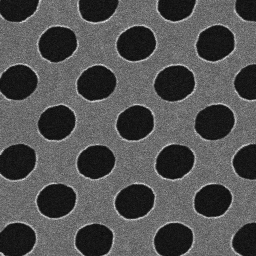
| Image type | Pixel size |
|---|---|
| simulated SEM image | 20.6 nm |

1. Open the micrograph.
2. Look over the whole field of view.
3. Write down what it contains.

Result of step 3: a regular array of holes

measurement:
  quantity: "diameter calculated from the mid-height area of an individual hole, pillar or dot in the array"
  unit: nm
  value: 763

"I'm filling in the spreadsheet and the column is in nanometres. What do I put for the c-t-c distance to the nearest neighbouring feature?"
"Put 1140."